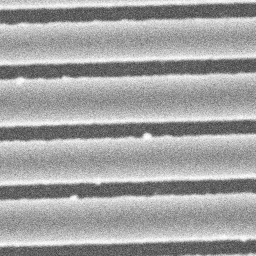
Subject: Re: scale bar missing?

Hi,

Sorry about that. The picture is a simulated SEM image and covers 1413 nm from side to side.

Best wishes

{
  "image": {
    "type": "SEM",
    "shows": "lines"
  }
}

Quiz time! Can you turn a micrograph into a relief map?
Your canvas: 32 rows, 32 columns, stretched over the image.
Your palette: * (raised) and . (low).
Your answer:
*******************.............
................................
.......................*********
********************************
********************************
********************************
********************************
****************.*..............
................................
.....................***********
********************************
********************************
********************************
********************************
********************************
******..........................
................................
.........*.*********************
********************************
********************************
********************************
********************************
*******************.............
................................
........................********
********************************
********************************
********************************
********************************
********************************
********........................
................................